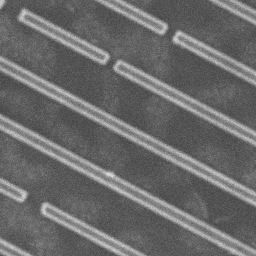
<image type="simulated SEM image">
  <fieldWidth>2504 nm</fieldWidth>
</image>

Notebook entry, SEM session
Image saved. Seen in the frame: parallel lines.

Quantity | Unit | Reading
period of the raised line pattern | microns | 0.519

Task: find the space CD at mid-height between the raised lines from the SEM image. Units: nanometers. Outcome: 415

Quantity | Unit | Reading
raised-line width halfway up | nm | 106